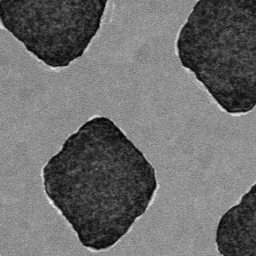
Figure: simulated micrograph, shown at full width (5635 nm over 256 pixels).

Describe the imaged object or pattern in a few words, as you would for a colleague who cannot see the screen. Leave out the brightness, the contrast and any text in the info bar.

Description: holes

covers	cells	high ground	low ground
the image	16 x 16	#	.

.......#####....
......######....
#.....#####.....
##...######.....
############....
#############...
##############..
######.#########
####....########
####.....#######
###.......######
###.......######
###......######.
####.....#####..
#####...######..
######.#######..